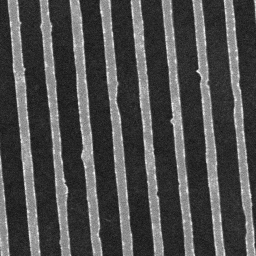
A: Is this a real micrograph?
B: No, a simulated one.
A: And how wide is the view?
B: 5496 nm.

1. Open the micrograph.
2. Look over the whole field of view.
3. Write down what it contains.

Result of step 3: parallel lines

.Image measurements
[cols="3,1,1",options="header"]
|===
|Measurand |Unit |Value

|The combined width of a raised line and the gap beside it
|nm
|659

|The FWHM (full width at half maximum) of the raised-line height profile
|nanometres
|203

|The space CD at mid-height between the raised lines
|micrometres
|0.465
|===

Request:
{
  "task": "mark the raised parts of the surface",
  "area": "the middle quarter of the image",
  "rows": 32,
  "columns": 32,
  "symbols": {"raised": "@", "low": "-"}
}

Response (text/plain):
---@@------@@-----@@------@@----
---@@------@@-----@@@-----@@----
---@@------@@------@@-----@@----
---@@------@@------@@-----@@----
---@@@-----@@------@@-----@@----
---@@@-----@@------@@------@@---
---@@@-----@@------@@------@@---
---@@@-----@@------@@------@@---
----@@-----@@------@@------@@---
----@@-----@@------@@------@@---
----@@------@------@@------@@---
----@@------@@-----@@------@@---
----@@------@@------@@-----@@---
----@@------@@------@@-----@@---
----@@------@@------@@-----@@---
----@@@-----@@------@@-----@@---
----@@@-----@@------@@-----@@@--
-----@@-----@@------@@------@@--
-----@@-----@@------@@------@@--
-----@@-----@@@-----@@------@@--
-----@@-----@@@-----@@------@@--
-----@@------@@-----@@------@@--
----@@@------@@-----@@------@@--
----@@@------@@-----@@@-----@@--
-----@@------@@-----@@@-----@@--
-----@@------@@------@@-----@@--
-----@@@-----@@------@@-----@@--
-----@@@-----@@------@@------@@-
-----@@@-----@@------@@------@@-
------@@-----@@------@@------@@-
@-----@@-----@@@-----@@------@@-
@-----@@-----@@@-----@@------@@-